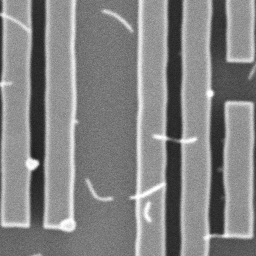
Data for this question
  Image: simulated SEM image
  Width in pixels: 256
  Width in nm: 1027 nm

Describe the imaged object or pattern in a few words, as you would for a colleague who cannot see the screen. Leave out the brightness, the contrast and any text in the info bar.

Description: groups of lines, slits or small figures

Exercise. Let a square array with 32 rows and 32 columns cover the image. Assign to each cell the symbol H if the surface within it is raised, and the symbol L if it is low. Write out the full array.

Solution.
HHHHLLHHHLLLLLLLLHHHHLLHHHLLHHHH
HHHHLLHHHLLLLLLLLHHHHLLHHHLLHHHH
HHHHLLHHHLLLLLLLLHHHHLLHHHLLHHHH
HHHHLLHHHLLLLLLLLHHHHLLHHHLLHHHH
HHHHLLHHHLLLLLLLLHHHHLLHHHLLHHHH
HHHHLLHHHLLLLLLLLHHHHLLHHHLLHHHH
HHHHLLHHHLLLLLLLLHHHHLLHHHLLHHHH
HHHHLLHHHLLLLLLLLHHHHLLHHHLLHHHL
HHHHLLHHHLLLLLLLLHHHHLLHHHLLLLLL
HHHHLLHHHLLLLLLLLHHHHLLHHHLLLLLL
HHHHLLHHHLLLLLLLLHHHHLLHHHLLLLLL
HHHHLLHHHLLLLLLLLHHHHLLHHHLLLLLL
HHHHLLHHHLLLLLLLLHHHHLLHHHLLLLLL
HHHHLLHHHLLLLLLLLHHHHLLHHHLLHHHH
HHHHLLHHHLLLLLLLLHHHHLLHHHLLHHHH
HHHHLLHHHLLLLLLLLHHHHLLHHHLLHHHH
HHHHLLHHHLLLLLLLLHHHHLLHHHLLHHHH
HHHHLLHHHLLLLLLLLHHHHLLHHHLLHHHH
HHHHLLHHHLLLLLLLLHHHHLLHHHLLHHHH
HHHHLLHHHLLLLLLLLHHHHLLHHHLLHHHH
HHHHHLHHHLLLLLLLLHHHHLLHHHLLHHHH
HHHHLLHHHLLLLLLLLHHHHLLHHHLLHHHH
HHHHLLHHHLLLLLLLLHHHHLLHHHLLHHHH
HHHHLLHHHLLLLLLLLHHHHLLHHHLLHHHL
HHHHLLHHHLLLLLLLLHHHHLLHHHLLHHHL
HHHHLLHHHLLLLLLLLHHHHLLHHHLLHHHL
HHHHLLHHHLLLLLLLLHHHHLLHHHLLHHHH
HHHHLLHHHLLLLLLLLHHHHLLHHHLLHHHH
LLLLLLLHHLLLLLLLLHHHHLLHHHLLHHHL
LLLLLLLLLLLLLLLLLHHHHLLHHHLLHHHL
LLLLLLLLLLLLLLLLLHHHHLLHHHLLLLLL
LLLLLLLLLLLLLLLLLHHHHLLHHHLLLLLL